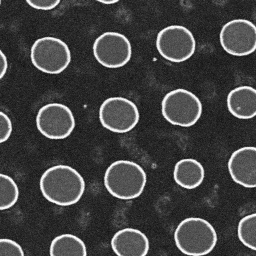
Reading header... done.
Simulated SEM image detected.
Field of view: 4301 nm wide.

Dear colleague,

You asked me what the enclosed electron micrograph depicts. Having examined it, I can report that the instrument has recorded a regular array of raised bodies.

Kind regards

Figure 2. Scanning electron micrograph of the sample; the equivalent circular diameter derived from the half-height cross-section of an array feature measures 597 nm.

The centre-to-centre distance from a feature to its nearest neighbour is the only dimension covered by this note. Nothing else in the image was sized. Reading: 1060 nanometres